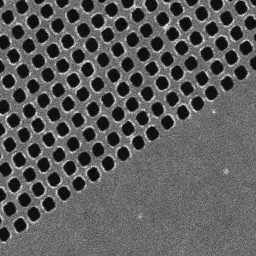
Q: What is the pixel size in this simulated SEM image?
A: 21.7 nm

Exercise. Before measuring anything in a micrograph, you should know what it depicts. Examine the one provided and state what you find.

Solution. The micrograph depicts a regular array of holes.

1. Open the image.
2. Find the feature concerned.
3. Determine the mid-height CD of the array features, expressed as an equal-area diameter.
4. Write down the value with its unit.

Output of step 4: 0.295 micrometres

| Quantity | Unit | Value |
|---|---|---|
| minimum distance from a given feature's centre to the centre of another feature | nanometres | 372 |